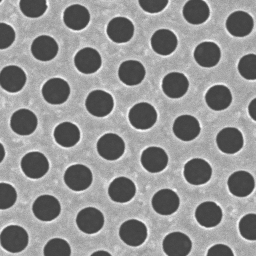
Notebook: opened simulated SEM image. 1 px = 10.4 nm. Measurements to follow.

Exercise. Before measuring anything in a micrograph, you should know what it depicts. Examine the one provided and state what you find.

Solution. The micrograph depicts a regular array of holes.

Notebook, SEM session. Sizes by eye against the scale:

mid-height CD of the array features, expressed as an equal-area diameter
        285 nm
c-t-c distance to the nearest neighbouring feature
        460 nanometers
